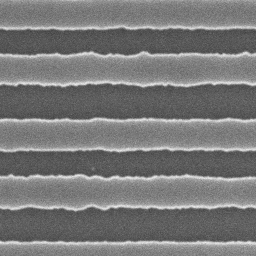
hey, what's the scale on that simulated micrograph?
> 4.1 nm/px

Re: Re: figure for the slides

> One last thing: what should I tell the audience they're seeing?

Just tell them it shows lines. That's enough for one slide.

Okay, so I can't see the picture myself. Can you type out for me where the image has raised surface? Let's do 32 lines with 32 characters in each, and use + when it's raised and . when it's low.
++++++++++++++++++++++++++++++++
++++++++++++++++++++++++++++++++
++++++++++++++++++++++++++++++++
++++++++++++++..+..++..++++++...
................................
................................
................................
++++++++++++++++++++++++++++++++
++++++++++++++++++++++++++++++++
++++++++++++++++++++++++++++++++
+++++++++++...+.+++++++++...+..+
................................
................................
................................
................................
++++++++++++++++++++++++++++++++
++++++++++++++++++++++++++++++++
++++++++++++++++++++++++++++++++
++++++++++++++++++++++++++++++++
................................
................................
................................
++++++++++++++++++++++++++++++++
++++++++++++++++++++++++++++++++
++++++++++++++++++++++++++++++++
++++++++++++++++++++++++++++++++
................................
................................
................................
................................
++++++++++++++++++++++++++++++++
++++++++++++++++++++++++++++++++